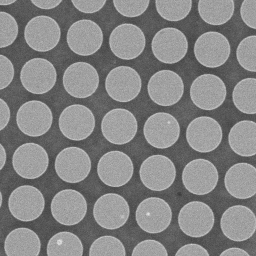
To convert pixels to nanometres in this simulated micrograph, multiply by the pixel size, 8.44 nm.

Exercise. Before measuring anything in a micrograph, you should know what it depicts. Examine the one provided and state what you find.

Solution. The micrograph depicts an array of small figures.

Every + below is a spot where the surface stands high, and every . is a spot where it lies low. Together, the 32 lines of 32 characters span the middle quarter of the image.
.++++++.........................
++++++++....++++++..............
++++++++...++++++++....+++++....
+++++++++..++++++++...+++++++...
++++++++..+++++++++..+++++++++..
++++++++..+++++++++..+++++++++..
++++++++...++++++++..+++++++++..
.++++++....++++++++..+++++++++..
............++++++....+++++++...
.......................+++++....
..+++...........................
++++++......++++................
+++++++....++++++......+++......
++++++++..++++++++...+++++++....
++++++++..++++++++..++++++++....
+++++++..+++++++++..+++++++++..+
+++++++..+++++++++..+++++++++..+
+++++++...++++++++..+++++++++..+
.+++++....+++++++...+++++++++..+
............++++.....+++++++...+
......................+++++.....
+++++...........................
++++++....+++++.................
++++++...+++++++.....+++++......
+++++++..++++++++...+++++++....+
++++++...++++++++..++++++++...++
++++++..+++++++++..+++++++++..++
++++++...++++++++..+++++++++..++
+++++....++++++++..+++++++++..++
..+.......++++++....+++++++...++
............++......++++++....++
+......................++......+